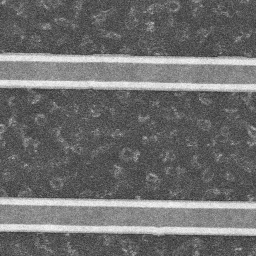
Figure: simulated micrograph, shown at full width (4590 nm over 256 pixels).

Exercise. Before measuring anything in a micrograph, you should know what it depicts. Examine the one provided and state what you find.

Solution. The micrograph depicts one or a few lines or trenches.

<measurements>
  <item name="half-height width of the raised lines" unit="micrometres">0.441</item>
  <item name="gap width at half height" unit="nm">2140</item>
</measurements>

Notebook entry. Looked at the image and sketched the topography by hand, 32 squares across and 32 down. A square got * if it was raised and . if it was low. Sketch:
................................
................................
................................
................................
................................
................................
................................
****************................
********************************
********************************
...........*********************
................................
................................
................................
................................
................................
................................
................................
................................
................................
................................
................................
................................
................................
................................
******************..............
********************************
********************************
......**************************
................................
................................
................................